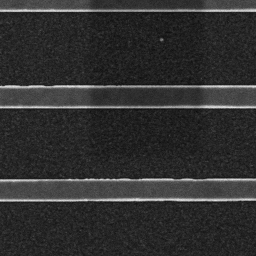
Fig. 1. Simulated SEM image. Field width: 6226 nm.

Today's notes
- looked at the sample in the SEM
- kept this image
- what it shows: lines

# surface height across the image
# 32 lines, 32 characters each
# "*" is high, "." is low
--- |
********************************
................................
................................
................................
................................
................................
................................
................................
................................
................................
................................
********************************
********************************
................................
................................
................................
................................
................................
................................
................................
................................
................................
..................***.....****.*
********************************
********************************
................................
................................
................................
................................
................................
................................
................................